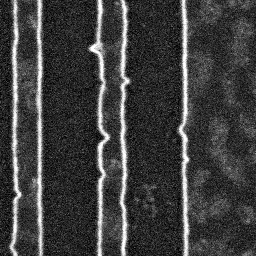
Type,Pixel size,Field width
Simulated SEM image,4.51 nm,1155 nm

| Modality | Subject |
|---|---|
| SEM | one or a few lines or trenches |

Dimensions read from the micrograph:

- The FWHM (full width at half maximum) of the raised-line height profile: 0.115 um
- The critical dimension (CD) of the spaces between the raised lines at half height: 59.7 px